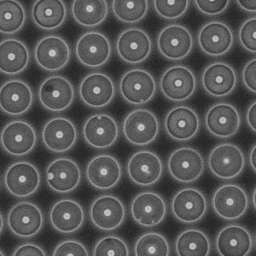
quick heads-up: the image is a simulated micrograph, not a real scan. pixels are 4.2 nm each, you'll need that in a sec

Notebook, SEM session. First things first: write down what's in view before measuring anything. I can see an array of small figures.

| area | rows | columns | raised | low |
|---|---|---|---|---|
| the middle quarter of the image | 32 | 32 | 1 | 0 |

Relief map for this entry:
11111111111111111111111111111111
11111111111111111111111111000001
11111111111111110000011110000000
11111100000111100000001110000000
01111000000011100000001100001000
00110000000011000010000100000000
00110000100011100000001110000000
00110000000011100000001110000000
00111000000011110000011111100011
01111100000111111001111111111111
01111111011111111111111111111111
11111111111111111111111111110001
11111111111111111000001111000000
11111110000111110000001111000000
01111100000011100000000111000100
00111000000001100001000111000100
00011000110001100001000111000000
00011000000001110000000111100000
00011100000001110000001111110011
00111110000011111000011111111111
01111111001111111111111111111111
11111111111111111111111111111000
11111111111111111110001111100000
11111111000011111000000111100000
00111110000001111000000011000000
00011100000001110000000011000010
00011100010000110000100011100000
00001100000000111000000011100000
00001100000001111000000111110000
00011110000001111100001111111111
00011111000111111111111111111111
01111111111111111111111111111100